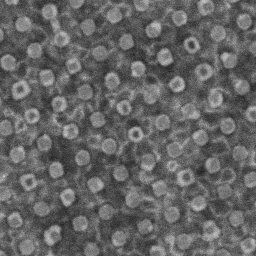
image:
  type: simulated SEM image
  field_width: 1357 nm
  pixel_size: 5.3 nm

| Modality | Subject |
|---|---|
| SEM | a regular array of raised bodies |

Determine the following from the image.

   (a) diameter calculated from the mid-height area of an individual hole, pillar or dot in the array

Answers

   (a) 14.4 px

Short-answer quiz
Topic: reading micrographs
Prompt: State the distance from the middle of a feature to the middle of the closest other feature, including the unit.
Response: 152 nm